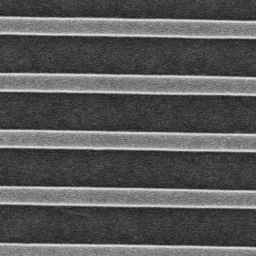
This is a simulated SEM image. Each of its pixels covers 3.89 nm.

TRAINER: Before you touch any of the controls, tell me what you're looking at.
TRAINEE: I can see parallel lines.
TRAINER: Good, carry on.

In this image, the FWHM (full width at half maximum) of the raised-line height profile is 65.6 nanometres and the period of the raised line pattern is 220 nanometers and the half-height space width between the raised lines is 154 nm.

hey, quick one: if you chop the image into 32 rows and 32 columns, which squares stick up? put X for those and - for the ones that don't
--------------------------------
--------------------------------
XXXXXXXXXXXXXXXXXX--------------
XXXXXXXXXXXXXXXXXXXXXXXXXXXXXXXX
-------------------XXXXXXXXXXXXX
--------------------------------
--------------------------------
--------------------------------
--------------------------------
XXXXXXXXXXXXXXXX----------------
XXXXXXXXXXXXXXXXXXXXXXXXXXXXXXXX
-----------XXXXXXXXXXXXXXXXXXXXX
--------------------------------
--------------------------------
--------------------------------
--------------------------------
XXXXXXXX--XX--------------------
XXXXXXXXXXXXXXXXXXXXXXXXXXXXXXXX
---------XXXXXXXXXXXXXXXXXXXXXXX
--------------------------------
--------------------------------
--------------------------------
--------------------------------
XXXXXX--X-X---------------------
XXXXXXXXXXXXXXXXXXXXXXXXXXXXXXXX
------XXXXXXXXXXXXXXXXXXXXXXXXXX
--------------------------------
--------------------------------
--------------------------------
--------------------------------
--------------------------------
XXXXXXXXXXXXXXXXXXXXXXXXXXXXXXXX